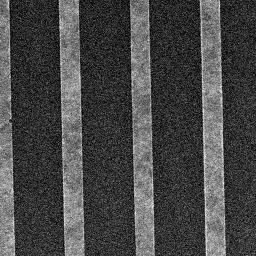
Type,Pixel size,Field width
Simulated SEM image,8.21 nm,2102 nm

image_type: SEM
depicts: one or a few lines or trenches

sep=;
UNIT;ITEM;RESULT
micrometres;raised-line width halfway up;0.158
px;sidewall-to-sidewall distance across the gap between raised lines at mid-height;51.9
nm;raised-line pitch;580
